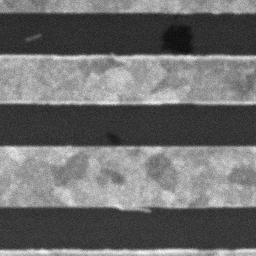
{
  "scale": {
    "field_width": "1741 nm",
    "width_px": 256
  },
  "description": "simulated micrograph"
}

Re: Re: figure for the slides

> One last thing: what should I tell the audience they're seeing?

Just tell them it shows lines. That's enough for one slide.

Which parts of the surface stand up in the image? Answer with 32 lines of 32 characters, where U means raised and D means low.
UUUUUUUUUUUUUUUUUUUUUUUUUUUUUUUU
DDDDDDDDDDDDDDDDDDDDUUUUDDUUDUUD
DDDDDDDDDDDDDDDDDDDDDDDDDDDDDDDD
DDDDDDDDDDDDDDDDDDDDDDDDDDDDDDDD
DDDDDDDDDDDDDDDDDDDDDDDDDDDDDDDD
DDDDDDDDDDDDDDDDDDDDDDDDDDDDDDDD
DDDDDDDDDDDDDDDDDDDDDDDDDDDDDDDD
UUUUUUUUUUUUUUUUUUUUUUUUUUUUUUUU
UUUUUUUUUUUUUUUUUUUUUUUUUUUUUUUU
UUUUUUUUUUUUUUUUUUUUUUUUUUUUUUUU
UUUUUUUUUUUUUUUUUUUUUUUUUUUUUUUU
UUUUUUUUUUUUUUUUUUUUUUUUUUUUUUUU
UUUUUUUUUUUUUUUUUUUUUUUUUUUUUUUU
DDDDDDDDDDDDDDDDDDDDDDDDDDDDDDDD
DDDDDDDDDDDDDDDDDDDDDDDDDDDDDDDD
DDDDDDDDDDDDDDDDDDDDDDDDDDDDDDDD
DDDDDDDDDDDDDDDDDDDDDDDDDDDDDDDD
DDDDDDDDDDDDDDDDDDDDDDDDDDDDDDDD
UUUUUUUUUUUUUUUUUUUUUUUUUUUUUUUU
UUUUUUUUUUUUUUUUUUUUUUUUUUUUUUUU
UUUUUUUUUUUUUUUUUUUUUUUUUUUUUUUU
UUUUUUUUUUUUUUUUUUUUUUUUUUUUUUUU
UUUUUUUUUUUUUUUUUUUUUUUUUUUUUUUU
UUUUUUUUUUUUUUUUUUUUUUUUUUUUUUUU
UUUUUUUUUUUUUUUUUUUUUUUUUUUUUUUU
UUUUUUUUUUUUUUUUUUUUUUUUUUUUUUUU
DDDDDDDDDDDDDDDDDDDDDDDDDDDDDDDD
DDDDDDDDDDDDDDDDDDDDDDDDDDDDDDDD
DDDDDDDDDDDDDDDDDDDDDDDDDDDDDDDD
DDDDDDDDDDDDDDDDDDDDDDDDDDDDDDDD
DDDDDDDDDDDDDDDDDDDDDDDDDDDDDDDD
UUUUUUUUUUUUUUUUUUUUUUUUUUUUUUUU